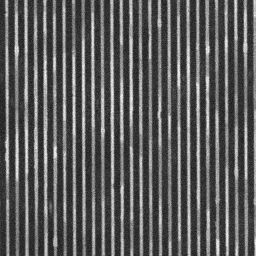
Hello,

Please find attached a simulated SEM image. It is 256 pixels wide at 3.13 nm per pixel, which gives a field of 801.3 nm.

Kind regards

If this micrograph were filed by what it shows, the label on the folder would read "parallel lines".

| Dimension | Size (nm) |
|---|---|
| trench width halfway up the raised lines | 20.4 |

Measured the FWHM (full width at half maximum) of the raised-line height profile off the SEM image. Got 7.8 nm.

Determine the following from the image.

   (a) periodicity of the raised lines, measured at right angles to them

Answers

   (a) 29.9 nm